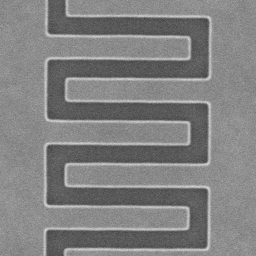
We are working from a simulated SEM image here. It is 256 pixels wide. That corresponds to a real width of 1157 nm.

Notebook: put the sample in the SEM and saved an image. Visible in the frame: groups of lines, slits or small figures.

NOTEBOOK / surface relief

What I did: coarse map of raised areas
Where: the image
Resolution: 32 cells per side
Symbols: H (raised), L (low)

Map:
HHHHHHLLHHHHHHHHHHHHHHHHHHHHHHHH
HHHHHHLLHHHHHHHHHHHHHHHHHHHHHHHH
HHHHHHLLLLLLLLLLLLLLLLLLLLHHHHHH
HHHHHHLLLLLLLLLLLLLLLLLLLLHHHHHH
HHHHHHHHHHHHLHHHHHLLLLLLLLHHHHHH
HHHHHHHHHHHHHHHHHHHHHHHHLLHHHHHH
HHHHHHHHHHHHHHHHHHHHHHHHLLHHHHHH
HHHHHHLLLLLLLLLLLLLLLLLLLLHHHHHH
HHHHHHLLLLLLLLLLLLLLLLLLLLHHHHHH
HHHHHHLLLLLLLLLLLLLLLLLLLLHHHHHH
HHHHHHLLHHHHHHHHHHHHHHHHHHHHHHHH
HHHHHHLLHHHHHHHHHHHHHHHHHHHHHHHH
HHHHHHLLLHHHHHHHHHHHHHHHHHHHHHHH
HHHHHHLLLLLLLLLLLLLLLLLLLLHHHHHH
HHHHHHLLLLLLLLLLLLLLLLLLLLHHHHHH
HHHHHHHHHHHHHHHHHHHHHHHHLLHHHHHH
HHHHHHHHHHHHHHHHHHHHHHHHLLHHHHHH
HHHHHHHHHHHHHHHHHHHHHHHHLLHHHHHH
HHHHHHLLLLLLLLLLLLLLLLLLLLHHHHHH
HHHHHHLLLLLLLLLLLLLLLLLLLLHHHHHH
HHHHHHLLLLLLLLLLLLLLLLLLLHHHHHHH
HHHHHHLLHHHHHHHHHHHHHHHHHHHHHHHH
HHHHHHLLHHHHHHHHHHHHHHHHHHHHHHHH
HHHHHHLLLLLLLLLLLLLLLLLLLLHHHHHH
HHHHHHLLLLLLLLLLLLLLLLLLLLHHHHHH
HHHHHHLLLLLLLLLLLLLLLLLLLLHHHHHH
HHHHHHHHHHHHHHHHHHHHHHHHLLHHHHHH
HHHHHHHHHHHHHHHHHHHHHHHHLLHHHHHH
HHHHHHHHHHHHHHHHHHHHHHHLLLHHHHHH
HHHHHHLLLLLLLLLLLLLLLLLLLLHHHHHH
HHHHHHLLLLLLLLLLLLLLLLLLLLHHHHHH
HHHHHHLLHHHHHHHHHHHHHHHHHHHHHHHH